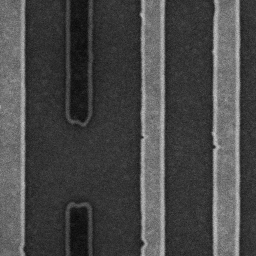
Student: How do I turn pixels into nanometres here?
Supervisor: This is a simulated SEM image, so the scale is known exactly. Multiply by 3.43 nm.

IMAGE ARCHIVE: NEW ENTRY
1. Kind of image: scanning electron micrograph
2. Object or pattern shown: one or a few lines or trenches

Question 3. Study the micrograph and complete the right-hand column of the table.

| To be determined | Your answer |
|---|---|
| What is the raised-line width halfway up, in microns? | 0.0779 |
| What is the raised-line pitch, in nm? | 252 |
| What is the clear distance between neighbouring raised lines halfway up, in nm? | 179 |